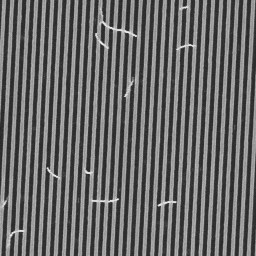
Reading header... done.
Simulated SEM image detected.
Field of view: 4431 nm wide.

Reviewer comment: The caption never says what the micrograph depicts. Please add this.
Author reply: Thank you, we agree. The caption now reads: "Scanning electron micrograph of parallel lines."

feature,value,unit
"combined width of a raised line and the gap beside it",139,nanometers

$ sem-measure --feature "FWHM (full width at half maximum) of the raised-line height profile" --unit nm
60.5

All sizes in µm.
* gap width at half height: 0.0778